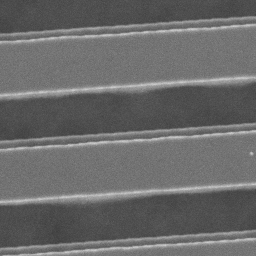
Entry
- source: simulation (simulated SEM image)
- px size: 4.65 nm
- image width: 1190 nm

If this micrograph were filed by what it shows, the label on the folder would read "lines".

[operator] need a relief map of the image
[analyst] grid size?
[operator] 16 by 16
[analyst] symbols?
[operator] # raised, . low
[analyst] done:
................
.........#######
################
################
################
#######.........
................
................
.....###########
################
################
################
##..............
................
...............#
.###############